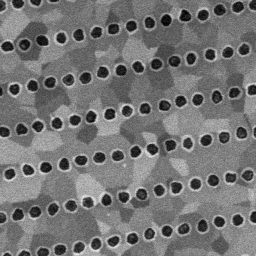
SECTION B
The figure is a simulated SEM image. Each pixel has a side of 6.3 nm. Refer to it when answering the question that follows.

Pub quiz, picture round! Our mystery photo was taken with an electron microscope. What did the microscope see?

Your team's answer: a regular array of holes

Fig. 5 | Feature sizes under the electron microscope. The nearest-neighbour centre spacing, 110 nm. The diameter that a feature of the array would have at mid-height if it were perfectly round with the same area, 76.9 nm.